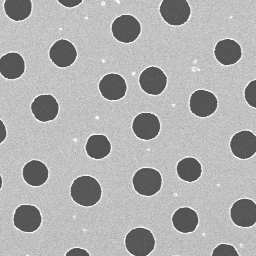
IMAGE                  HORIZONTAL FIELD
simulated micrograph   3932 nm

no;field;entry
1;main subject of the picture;a regular array of holes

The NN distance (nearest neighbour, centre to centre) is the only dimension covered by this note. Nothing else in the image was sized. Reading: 0.706 micrometres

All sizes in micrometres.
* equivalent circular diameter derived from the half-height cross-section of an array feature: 0.421